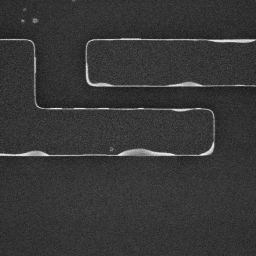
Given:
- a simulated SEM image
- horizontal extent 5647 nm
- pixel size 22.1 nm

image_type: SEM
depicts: groups of lines, slits or small figures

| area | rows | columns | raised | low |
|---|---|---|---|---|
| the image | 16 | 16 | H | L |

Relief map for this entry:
LLLLLLLLLLLLLLLL
LLLLLLLLLLLLLLLL
HHLLLLHHHHHHLLLL
HHLLLHHHHHHHHHHH
HHLLLHHHHHHHHHHH
HHLLLLLLLLLLLLLL
HHLLLLLLLLLLLLLL
HHHHHHHHHHHHHLLL
HHHHHHHHHHHHHLLL
HHHHHHHHHHHHHLLL
LLLLLLLLLLLLLLLL
LLLLLLLLLLLLLLLL
LLLLLLLLLLLLLLLL
LLLLLLLLLLLLLLLL
LLLLLLLLLLLLLLLL
LLLLLLLLLLLLLLLL